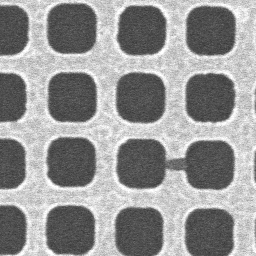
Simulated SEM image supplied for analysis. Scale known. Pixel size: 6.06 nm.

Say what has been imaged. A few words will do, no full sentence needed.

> holes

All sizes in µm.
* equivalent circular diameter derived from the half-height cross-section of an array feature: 0.324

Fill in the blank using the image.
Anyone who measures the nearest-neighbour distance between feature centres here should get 406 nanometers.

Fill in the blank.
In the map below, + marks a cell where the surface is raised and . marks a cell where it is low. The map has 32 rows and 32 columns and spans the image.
+++++++....+++++++++++++++++++++
...+++......+++.....++++.....+++
....++......+++......++......+++
....++......+++......++.......++
....++......+++......++......+++
...+++......+++......++......+++
...++++....++++.....++++.....+++
++++++++++++++++++++++++++++++++
++++++++++++++++++++++++++++++++
...++++....++++.....++++....++++
...+++......+++......++......+++
...+++......++.......++......+++
...+++......++.......++......+++
...+++......+++......++......+++
...+++......+++.....++++.....+++
++++++++++++++++++++++++++++++++
++++++++++++++++++++++++++++++++
..+++++....+++++...++++++...++++
...+++......+++......++......+++
...+++......+++......++......+++
...+++......++...............+++
...+++......+++......++......+++
...+++......+++......++......+++
..++++++++++++++...+++++....++++
++++++++++++++++++++++++++++++++
++++++++++++++++++++++++++++++++
...+++.....++++.....++++....++++
...+++......++......+++......+++
...+++......++......+++......+++
...+++......++......+++......+++
...+++......++......+++......+++
..+++++....++++.....++++.....+++